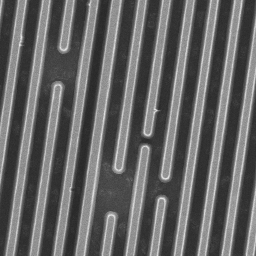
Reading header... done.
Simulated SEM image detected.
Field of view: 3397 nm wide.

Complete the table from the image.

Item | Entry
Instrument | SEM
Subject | parallel lines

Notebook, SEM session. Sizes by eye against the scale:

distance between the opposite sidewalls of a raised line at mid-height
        0.136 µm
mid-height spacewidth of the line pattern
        180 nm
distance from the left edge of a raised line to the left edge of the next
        315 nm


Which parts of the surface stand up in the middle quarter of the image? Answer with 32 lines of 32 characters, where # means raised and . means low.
....##...###....###...###...###.
....##...###....##....##....##..
....##...###....##....##....##..
....##...###....##....##....##..
...###...###....##....##....##..
...###...###...###...###...###..
...###...##....###...###...###..
...##...###....###...###...###..
...##...###....##....##....##...
...##...###....##....##....##...
...##...###....##...###....##...
..###...###....##....##....##...
..###...###...###...###...###...
..###...##....###...###...###...
..##...###....###...###...###...
..##...###....##....##....##....
..##...###....##....##....##....
..##...###....##....##....##....
.###...###....##..........##....
.###...###...###.........###...#
.###...##....###...##....###...#
.##...###....###...###...###...#
.##...###....##....##....##....#
.##...###....##....##....##....#
.##...###....##....##....##....#
###...###....##....##....##....#
###...###....##...###...###...##
###...##..........###...###...##
##...###..........###...###...##
##...###..........##..........##
##...###..........##..........##
##...###..........##..........##